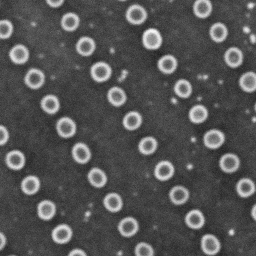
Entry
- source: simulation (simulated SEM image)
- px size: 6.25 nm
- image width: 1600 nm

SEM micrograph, a regular array of raised bodies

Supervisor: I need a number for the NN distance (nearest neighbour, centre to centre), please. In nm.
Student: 181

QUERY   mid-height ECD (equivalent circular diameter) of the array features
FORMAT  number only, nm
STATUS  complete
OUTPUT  108